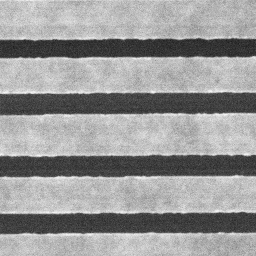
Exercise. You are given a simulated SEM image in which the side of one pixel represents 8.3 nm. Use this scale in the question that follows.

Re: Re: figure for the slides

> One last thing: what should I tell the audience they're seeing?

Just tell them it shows lines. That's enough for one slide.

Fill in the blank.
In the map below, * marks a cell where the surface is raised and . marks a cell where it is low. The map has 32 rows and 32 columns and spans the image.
********************************
********************************
********************************
********************************
********************************
................................
................................
********************************
********************************
********************************
********************************
************.*.**..*............
................................
................................
********************************
********************************
********************************
********************************
********************************
................................
................................
................................
********************************
********************************
********************************
********************************
*************.****.*****.*......
................................
................................
********************************
********************************
********************************